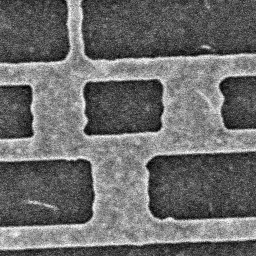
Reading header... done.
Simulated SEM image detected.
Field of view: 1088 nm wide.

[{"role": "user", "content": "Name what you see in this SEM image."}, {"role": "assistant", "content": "one or a few lines or trenches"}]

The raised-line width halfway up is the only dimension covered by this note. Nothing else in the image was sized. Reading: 0.0898 micrometres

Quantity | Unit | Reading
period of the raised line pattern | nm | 347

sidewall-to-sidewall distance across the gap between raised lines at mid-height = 276 nanometres